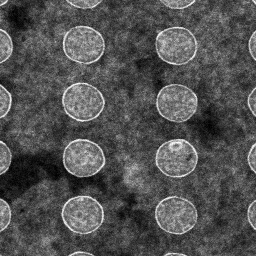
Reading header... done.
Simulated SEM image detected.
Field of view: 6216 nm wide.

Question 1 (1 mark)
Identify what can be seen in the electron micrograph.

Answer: a regular array of raised bodies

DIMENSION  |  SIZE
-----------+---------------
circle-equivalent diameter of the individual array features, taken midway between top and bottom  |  948 nm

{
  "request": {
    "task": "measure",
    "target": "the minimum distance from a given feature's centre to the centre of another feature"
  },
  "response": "1.37 microns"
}